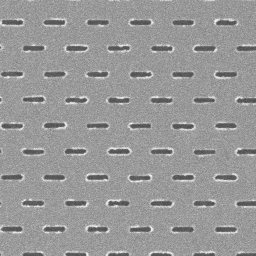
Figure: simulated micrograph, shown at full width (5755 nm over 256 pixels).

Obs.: a regular array of holes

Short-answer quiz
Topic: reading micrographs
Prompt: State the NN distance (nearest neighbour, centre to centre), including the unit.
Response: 750 nanometers